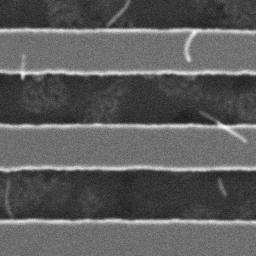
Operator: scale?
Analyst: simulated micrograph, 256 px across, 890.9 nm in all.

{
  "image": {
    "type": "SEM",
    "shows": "lines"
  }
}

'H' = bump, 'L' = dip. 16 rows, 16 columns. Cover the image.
LLLLLLLLLLLLLLLL
LLLLLLLLLLLLLLLL
HHHHHHHHHHHHHHHH
HHHHHHHHHHHHHHHH
HHHHHHHHHHHHHHHH
LLLLLLLLLLLLLLLL
LLLLLLLLLLLLLLLL
LLLLLLLLLLLLLLLL
HHHHHHHHHHHHHHHH
HHHHHHHHHHHHHHHH
HHHHHHHHHHHHHHHH
LLLLLLLLLLLLLLLL
LLLLLLLLLLLLLLLL
LLLLLLLLLLLLLLLL
HHHHHHHHHHHHHHHH
HHHHHHHHHHHHHHHH